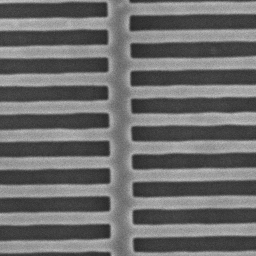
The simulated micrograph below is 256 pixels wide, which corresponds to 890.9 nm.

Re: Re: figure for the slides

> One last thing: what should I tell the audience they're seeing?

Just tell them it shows groups of lines, slits or small figures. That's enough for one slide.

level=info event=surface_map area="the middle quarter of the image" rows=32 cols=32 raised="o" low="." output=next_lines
...........ooooooooooooooooooooo
...........ooooooo..............
ooooooooooooooooo...............
ooooooooooooooooo...............
ooooooooooooooooo...............
...........oooooo.........oooooo
...........ooooooooooooooooooooo
...........ooooooooooooooooooooo
...........ooooooooooo.....ooo..
ooooooooooooooooo...............
ooooooooooooooooo...............
ooooooooooooooooo...............
...........oooooo...............
...........ooooooooooooooooooooo
............oooooooooooooooooooo
...........oooooo...............
o....oooooooooooo...............
ooooooooooooooooo...............
ooooooooooooooooo...............
...........ooooooo............oo
............oooooooooooooooooooo
............oooooooooooooooooooo
............oooooo..............
ooooooooooooooooo...............
ooooooooooooooooo...............
ooooooooooooooooo...............
............oooooo...ooooooooooo
............oooooooooooooooooooo
............oooooooooooooooooooo
............oooooo..............
ooooooooooooooooo...............
ooooooooooooooooo...............